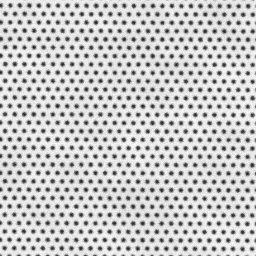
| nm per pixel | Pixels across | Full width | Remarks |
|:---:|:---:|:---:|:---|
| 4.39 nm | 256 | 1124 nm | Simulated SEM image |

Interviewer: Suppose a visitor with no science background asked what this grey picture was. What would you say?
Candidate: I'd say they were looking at a regular array of holes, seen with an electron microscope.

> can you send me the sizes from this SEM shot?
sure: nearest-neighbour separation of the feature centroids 0.0406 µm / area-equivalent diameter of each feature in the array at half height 20.4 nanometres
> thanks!